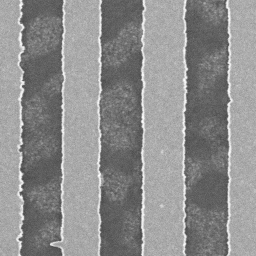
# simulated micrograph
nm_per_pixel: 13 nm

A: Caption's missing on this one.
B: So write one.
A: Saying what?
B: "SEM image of one or a few lines or trenches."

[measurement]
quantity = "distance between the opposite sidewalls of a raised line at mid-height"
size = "522 nm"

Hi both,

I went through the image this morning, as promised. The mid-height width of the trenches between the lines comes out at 0.556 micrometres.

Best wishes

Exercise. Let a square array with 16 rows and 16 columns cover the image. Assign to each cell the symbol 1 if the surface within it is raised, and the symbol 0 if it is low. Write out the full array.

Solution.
1000110001110011
1000110001110011
1000110001110011
1000110001110011
1000110001110011
1000110001110011
1000110001110011
1000110001110011
1000110001110011
1000110001100011
1000110001100011
1000110001110011
1000110001110011
1000110001110011
1000110001110011
1000110001110011